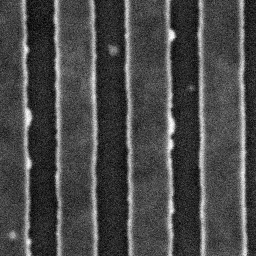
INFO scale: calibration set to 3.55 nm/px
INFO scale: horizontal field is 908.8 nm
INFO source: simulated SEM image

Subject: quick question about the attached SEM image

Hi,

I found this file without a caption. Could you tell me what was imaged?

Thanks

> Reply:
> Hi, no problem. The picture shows lines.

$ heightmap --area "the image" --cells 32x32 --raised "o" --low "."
ooo....ooooo....ooooo....ooooo..
ooo....ooooo....ooooo....ooooo..
ooo....ooooo....ooooo....ooooo..
ooo....ooooo....ooooo....ooooo..
ooo....ooooo....ooooo....ooooo..
ooo....ooooo....ooooo....ooooo..
ooo....ooooo....ooooo....ooooo..
ooo....ooooo....ooooo....ooooo..
ooo....ooooo....ooooo....ooooo..
ooo....ooooo....ooooo....ooooo..
ooo....ooooo....ooooo....ooooo..
ooo....ooooo....ooooo....ooooo..
ooo....ooooo....ooooo....ooooo..
ooo....ooooo....ooooo....oooooo.
ooo....ooooo....ooooo....oooooo.
ooo....ooooo....ooooo....oooooo.
ooo....ooooo....ooooo....oooooo.
ooo....ooooo....ooooo....oooooo.
ooo....ooooo....ooooo....oooooo.
oooo...ooooo....ooooo....oooooo.
oooo...ooooo....ooooo....oooooo.
oooo...ooooo....ooooo....oooooo.
oooo...ooooo....ooooo....oooooo.
oooo...ooooo....oooooo...oooooo.
oooo...ooooo....oooooo...oooooo.
oooo...ooooo....ooooo....oooooo.
oooo...ooooo....ooooo....oooooo.
oooo...ooooo....ooooo....oooooo.
oooo...ooooo....ooooo....oooooo.
ooo....ooooo....oooooo...oooooo.
oooo...ooooo....ooooo....oooooo.
oooo...ooooo....ooooo....oooooo.